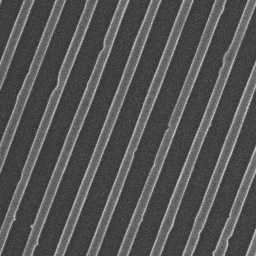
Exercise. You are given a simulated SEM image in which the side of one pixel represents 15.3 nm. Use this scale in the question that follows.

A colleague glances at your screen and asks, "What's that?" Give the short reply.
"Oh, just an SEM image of parallel lines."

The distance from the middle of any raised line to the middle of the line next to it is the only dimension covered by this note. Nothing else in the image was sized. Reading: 455 nm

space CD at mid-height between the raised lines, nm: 322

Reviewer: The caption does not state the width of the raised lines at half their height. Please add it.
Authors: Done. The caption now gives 141 nm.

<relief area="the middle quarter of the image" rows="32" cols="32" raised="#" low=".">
##......##.....###......##......
##.....###.....###.....###.....#
#......##......##......##......#
#......##......##.....###......#
......###.....###.....###.....##
......##......##......##......##
......##.....###.....###.....###
.....###.....##......##......##.
.....##......##......##......##.
....###.....###.....###.....###.
....##......##......##......##..
...###......##.....###......##..
...###.....###.....##......##...
...##......##......##......##...
..###.....###.....###.....###...
..##......##......##......##....
.###......##......##......##....
.###.....###.....##......###....
.##......##......##......##.....
###.....###......##......##.....
##......##......##......##......
##......##......##......##......
##.....###.....##......###.....#
#......##......##......##......#
#......##......##......##......#
......##......###.....##......##
......##......##......##......##
.....###......##.....###.....###
.....##......##......##......##.
.....##......##......##.....###.
....##......###.....###.....##..
....##......##......##......##..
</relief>